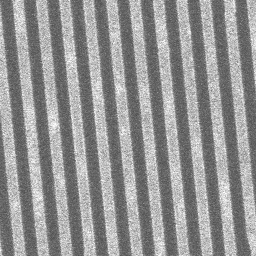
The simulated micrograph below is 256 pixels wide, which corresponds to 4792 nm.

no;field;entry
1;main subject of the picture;parallel lines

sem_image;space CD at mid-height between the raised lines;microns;0.212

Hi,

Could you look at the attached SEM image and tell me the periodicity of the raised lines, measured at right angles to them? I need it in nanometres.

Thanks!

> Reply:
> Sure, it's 436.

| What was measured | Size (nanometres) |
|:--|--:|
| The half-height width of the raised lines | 228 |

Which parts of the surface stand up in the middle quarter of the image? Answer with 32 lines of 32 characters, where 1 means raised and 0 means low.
11100011100011100011100011100011
01100011100011100011100011100011
01100011100011100011100011100011
01100011100011100011100011100011
01110001100011100011100011100011
01110001110001100011100011100011
01110001110001110001100011100011
01110001110001110001110001100011
01110001110001110001100001100011
01110001110001110001110001100011
01110001110001110001110001110001
00110001110001110001110001110001
00110000110001110001110001110001
00110000110001110001110001110001
00111000110001110001110001110001
00111000111000110001110001110001
00111000111000111000110000110001
00111000111000111000111000110001
00111000111000111000111000110001
00111000111000111000111000110001
00111000111000111000111000111000
00011000111000111000111000111000
00011000111000111000111000111000
00011000111000111000111000111000
00011100011000111000111000111000
00011100011100011000111000111000
00011100011100011100011100011000
00011100011100011100011100011000
00011100011100011100011100011000
00011100011100011100011100011000
00001100011100011100011100011100
10001100011100011100011100011100